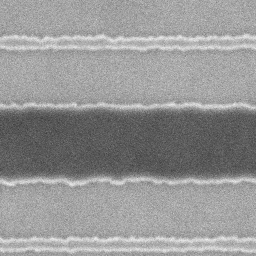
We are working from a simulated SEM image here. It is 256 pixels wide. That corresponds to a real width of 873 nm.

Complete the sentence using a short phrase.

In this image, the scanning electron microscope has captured lines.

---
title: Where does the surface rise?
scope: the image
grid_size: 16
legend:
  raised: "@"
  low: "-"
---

----------------
----------------
----------------
----------------
----------------
----------------
------@---@@----
@@@@@@@@@@@@@@@@
@@@@@@@@@@@@@@@@
@@@@@@@@@@@@@@@@
@@@@@@@@@@@@@@@@
@---------------
----------------
----------------
----------------
----------------